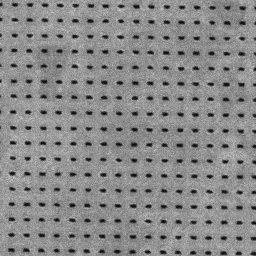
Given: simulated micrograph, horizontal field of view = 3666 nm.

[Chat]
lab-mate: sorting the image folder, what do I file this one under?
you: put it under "a regular array of holes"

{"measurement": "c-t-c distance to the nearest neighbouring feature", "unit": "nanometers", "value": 214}